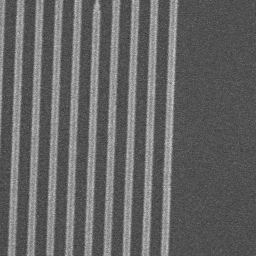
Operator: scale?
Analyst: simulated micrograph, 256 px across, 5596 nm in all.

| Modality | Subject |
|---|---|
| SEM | parallel lines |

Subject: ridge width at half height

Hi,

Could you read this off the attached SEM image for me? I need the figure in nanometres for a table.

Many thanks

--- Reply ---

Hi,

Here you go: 126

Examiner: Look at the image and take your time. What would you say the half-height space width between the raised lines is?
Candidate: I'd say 0.292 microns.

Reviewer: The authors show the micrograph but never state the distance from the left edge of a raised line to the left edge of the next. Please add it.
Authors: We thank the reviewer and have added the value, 418 nm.